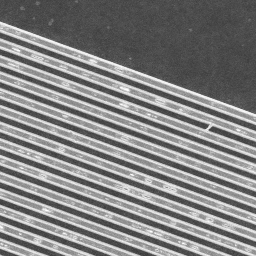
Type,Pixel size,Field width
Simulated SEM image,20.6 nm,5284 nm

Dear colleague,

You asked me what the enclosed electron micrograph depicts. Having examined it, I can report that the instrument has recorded parallel lines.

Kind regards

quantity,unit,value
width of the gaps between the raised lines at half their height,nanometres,162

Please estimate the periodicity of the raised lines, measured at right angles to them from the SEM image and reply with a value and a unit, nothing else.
323 nm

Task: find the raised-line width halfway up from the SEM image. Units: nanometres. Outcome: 162